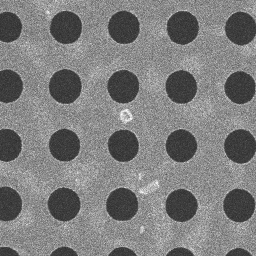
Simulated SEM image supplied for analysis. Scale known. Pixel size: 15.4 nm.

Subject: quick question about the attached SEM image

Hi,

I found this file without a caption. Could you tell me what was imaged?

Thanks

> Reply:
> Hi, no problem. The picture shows a regular array of holes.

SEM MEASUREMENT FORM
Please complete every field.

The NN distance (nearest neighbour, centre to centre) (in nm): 893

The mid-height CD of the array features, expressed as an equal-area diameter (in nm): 511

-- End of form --